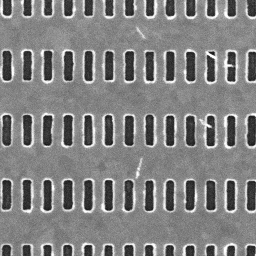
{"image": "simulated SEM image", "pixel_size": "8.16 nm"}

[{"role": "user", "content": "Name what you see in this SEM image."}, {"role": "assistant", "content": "a regular array of holes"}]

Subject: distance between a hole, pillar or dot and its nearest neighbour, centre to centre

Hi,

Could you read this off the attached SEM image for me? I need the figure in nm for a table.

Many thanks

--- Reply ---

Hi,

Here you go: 165